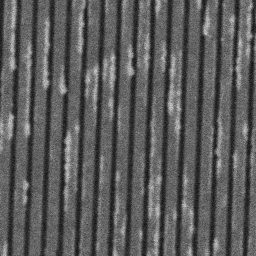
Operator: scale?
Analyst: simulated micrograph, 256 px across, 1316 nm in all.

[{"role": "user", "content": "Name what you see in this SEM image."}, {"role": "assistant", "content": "parallel lines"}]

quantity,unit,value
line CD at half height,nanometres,53.3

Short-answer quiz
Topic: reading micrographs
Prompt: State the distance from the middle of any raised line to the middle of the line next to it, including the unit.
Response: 86.3 nanometers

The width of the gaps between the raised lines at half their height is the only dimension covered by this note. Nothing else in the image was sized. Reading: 33.4 nanometres